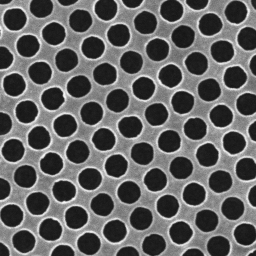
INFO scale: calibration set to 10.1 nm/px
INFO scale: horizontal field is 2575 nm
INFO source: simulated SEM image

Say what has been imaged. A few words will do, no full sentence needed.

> a regular array of holes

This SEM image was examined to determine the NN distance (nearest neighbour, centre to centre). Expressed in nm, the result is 290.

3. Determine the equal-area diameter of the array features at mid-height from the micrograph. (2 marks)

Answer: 235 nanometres